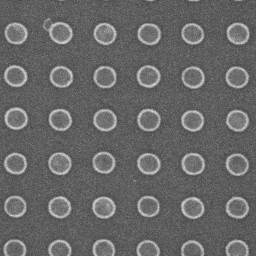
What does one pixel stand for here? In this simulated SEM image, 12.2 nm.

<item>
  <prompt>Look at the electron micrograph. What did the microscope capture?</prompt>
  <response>a regular array of raised bodies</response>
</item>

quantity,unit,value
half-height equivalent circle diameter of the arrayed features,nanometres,257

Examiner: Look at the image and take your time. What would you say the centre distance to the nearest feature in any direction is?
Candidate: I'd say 529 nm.